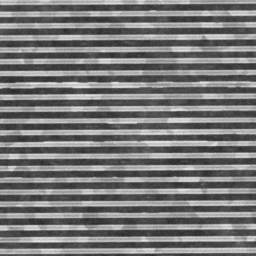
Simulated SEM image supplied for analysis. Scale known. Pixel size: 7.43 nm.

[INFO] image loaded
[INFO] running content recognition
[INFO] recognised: parallel lines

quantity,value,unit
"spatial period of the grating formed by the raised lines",0.0882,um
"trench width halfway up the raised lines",0.0585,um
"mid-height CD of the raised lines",26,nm